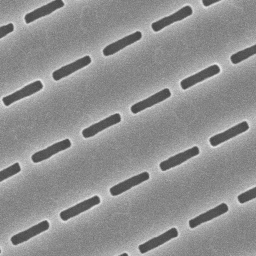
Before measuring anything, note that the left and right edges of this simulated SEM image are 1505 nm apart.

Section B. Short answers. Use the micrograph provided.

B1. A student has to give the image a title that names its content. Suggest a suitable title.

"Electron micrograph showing a regular array of holes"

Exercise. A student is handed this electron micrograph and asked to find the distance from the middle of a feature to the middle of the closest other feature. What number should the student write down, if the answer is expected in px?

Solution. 55.5